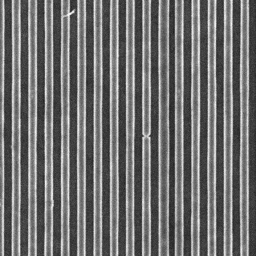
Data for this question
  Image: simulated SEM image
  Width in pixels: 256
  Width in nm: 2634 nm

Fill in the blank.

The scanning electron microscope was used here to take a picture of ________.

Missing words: parallel lines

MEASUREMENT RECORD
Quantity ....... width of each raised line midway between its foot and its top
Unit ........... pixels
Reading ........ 7.75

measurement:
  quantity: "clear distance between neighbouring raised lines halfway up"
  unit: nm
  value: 90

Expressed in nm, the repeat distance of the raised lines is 168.